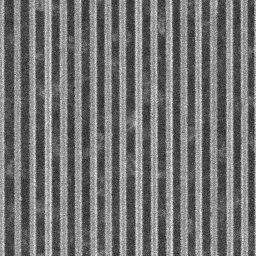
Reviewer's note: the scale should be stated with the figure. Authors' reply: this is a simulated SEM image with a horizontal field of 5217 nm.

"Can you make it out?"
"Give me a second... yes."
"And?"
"parallel lines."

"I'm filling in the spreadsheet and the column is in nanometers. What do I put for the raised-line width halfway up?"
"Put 96.8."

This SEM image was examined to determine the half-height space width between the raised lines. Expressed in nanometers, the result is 212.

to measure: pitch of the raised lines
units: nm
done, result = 308